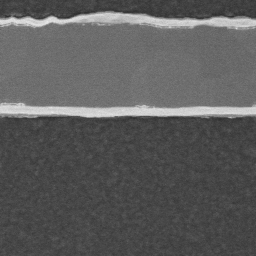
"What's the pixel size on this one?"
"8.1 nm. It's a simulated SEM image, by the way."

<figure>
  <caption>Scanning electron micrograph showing one or a few lines or trenches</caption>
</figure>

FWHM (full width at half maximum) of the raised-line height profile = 734 nm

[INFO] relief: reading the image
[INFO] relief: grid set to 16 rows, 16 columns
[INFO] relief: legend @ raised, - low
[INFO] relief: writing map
----------------
@@@@@@@@@@@@@@@@
@@@@@@@@@@@@@@@@
@@@@@@@@@@@@@@@@
@@@@@@@@@@@@@@@@
@@@@@@@@@@@@@@@@
@@@@@@@@@@@@@@@@
----------------
----------------
----------------
----------------
----------------
----------------
----------------
----------------
----------------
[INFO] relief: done